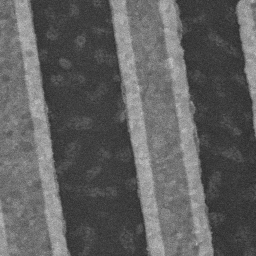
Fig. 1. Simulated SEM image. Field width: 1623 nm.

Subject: one or a few lines or trenches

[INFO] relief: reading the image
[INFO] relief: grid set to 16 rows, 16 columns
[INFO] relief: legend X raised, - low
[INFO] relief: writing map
XX-----XXXX----X
XX------XXX----X
XX------XXX----X
XX------XXX-----
XX------XXX-----
XX------XXX-----
XX------XXX-----
XXX-----XXXX----
XXX------XXX----
XXX------XXX----
XXX------XXX----
XXX------XXX----
XXX------XXX----
XXX------XXXX---
XXXX------XXX---
XXXX------XXX---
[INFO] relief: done